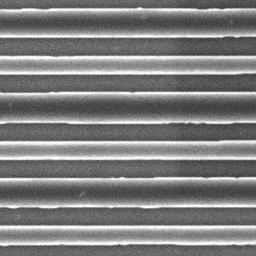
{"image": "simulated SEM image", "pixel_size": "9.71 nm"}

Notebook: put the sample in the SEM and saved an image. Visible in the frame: lines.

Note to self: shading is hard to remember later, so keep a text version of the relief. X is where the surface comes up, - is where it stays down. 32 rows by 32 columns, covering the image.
--------------------------------
XXXXXXXXXXXXXXXXXXXXXXXXXXXXXXXX
XXXXXXXXXXXXXXXXXXXXXXXXXXXXXXXX
XXXXXXXXXXXXXXXXXXXXXXXXXXXXXXXX
XXXXXXXXXXXXXXXXXXXXXXXXXXXX----
--------------------------------
--------------------------------
XXXXXXXXXXXXXXXXXXXXXXXXXXXXXXXX
XXXXXXXXXXXXXXXXXXXXXXXXXXXXXXXX
--------------------------------
--------------------------------
--------------------------------
XXXXXXXXXXXXXXXXXXXXXXXXXXXXXXXX
XXXXXXXXXXXXXXXXXXXXXXXXXXXXXXXX
XXXXXXXXXXXXXXXXXXXXXXXXXXXXXXXX
--------------------------------
--------------------------------
--------------------------------
XXXXXXXXXXXXXXXXXXXXXXXXXXXXXXXX
XXXXXXXXXXXXXXXXXXXXXXXXXXXXXXXX
--------------------------------
--------------------------------
XXXXXXXXXXXXXXXXXXXXXXXXXXXXXXXX
XXXXXXXXXXXXXXXXXXXXXXXXXXXXXXXX
XXXXXXXXXXXXXXXXXXXXXXXXXXXXXXXX
XXXXXXXXXXXXXXXXXXXXXXXXXXXXXXXX
--------------------------------
--------------------------------
XXXXXXXXXXXXXXXXXXXXXXXXXXXXXXXX
XXXXXXXXXXXXXXXXXXXXXXXXXXXXXXXX
XXXXXX--------------------------
--------------------------------